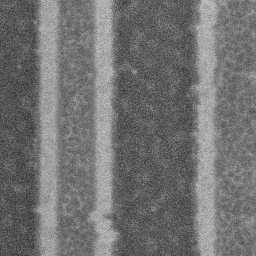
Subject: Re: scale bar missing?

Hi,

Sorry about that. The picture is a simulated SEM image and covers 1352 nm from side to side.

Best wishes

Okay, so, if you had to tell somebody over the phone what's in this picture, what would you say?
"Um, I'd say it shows one or a few lines or trenches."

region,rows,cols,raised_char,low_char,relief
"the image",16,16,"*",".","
...***.......***
...***.......***
...***.......***
...***.......***
...****......***
...***.......***
...***.......***
...***.......***
...***.......***
...***.......***
...***.......***
...***.......***
...***.......***
...***.......***
...****......***
...***.......***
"